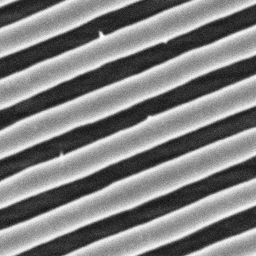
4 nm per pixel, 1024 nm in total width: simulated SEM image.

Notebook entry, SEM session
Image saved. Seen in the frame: parallel lines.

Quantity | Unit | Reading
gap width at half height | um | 0.082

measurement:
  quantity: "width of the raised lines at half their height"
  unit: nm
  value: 106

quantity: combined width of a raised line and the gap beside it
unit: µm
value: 0.188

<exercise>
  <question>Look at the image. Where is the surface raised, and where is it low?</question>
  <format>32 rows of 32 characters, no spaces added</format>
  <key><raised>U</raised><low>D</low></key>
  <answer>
UDDDDDDDUUUUUUUUDDDDDDDUUUUUUUUU
DDDDDUUUUUUUUDDDDDDDUUUUUUUUUDDD
DDDUUUUUUUUDDDDDDDUUUUUUUUUDDDDD
UUUUUUUUUDDDDDDUUUUUUUUUUDDDDDDU
UUUUUUUDDDDDDUUUUUUUUUDDDDDDDUUU
UUUUDDDDDDDUUUUUUUUDDDDDDDUUUUUU
UUDDDDDDUUUUUUUUUDDDDDDDUUUUUUUU
DDDDDDUUUUUUUUDDDDDDDUUUUUUUUUDD
DDDDUUUUUUUUDDDDDDDUUUUUUUUDDDDD
DUUUUUUUUDDDDDDDDUUUUUUUUDDDDDDD
UUUUUUUDDDDDDDUUUUUUUUUDDDDDDUUU
UUUUUDDDDDDDUUUUUUUUUDDDDDDUUUUU
UUUDDDDDDUUUUUUUUUDDDDDDUUUUUUUU
DDDDDDDUUUUUUUUUDDDDDDUUUUUUUUUD
DDDDUUUUUUUUUDDDDDDUUUUUUUUUDDDD
DDUUUUUUUUUDDDDDDUUUUUUUUUDDDDDD
UUUUUUUUDDDDDDDUUUUUUUUUDDDDDDUU
UUUUUUDDDDDDUUUUUUUUUDDDDDDDUUUU
UUUDDDDDDDUUUUUUUUUDDDDDDUUUUUUU
UDDDDDDDUUUUUUUUDDDDDDDUUUUUUUUU
DDDDDUUUUUUUUUDDDDDDUUUUUUUUUDDD
DDDUUUUUUUUUDDDDDDUUUUUUUUUDDDDD
DUUUUUUUUDDDDDDUUUUUUUUUUDDDDDDU
UUUUUUUDDDDDDUUUUUUUUUDDDDDDDUUU
UUUUDDDDDDDUUUUUUUUUDDDDDDUUUUUU
UDDDDDDDUUUUUUUUUUDDDDDDUUUUUUUU
DDDDDDUUUUUUUUUDDDDDDDUUUUUUUUDD
DDDDUUUUUUUUDDDDDDDUUUUUUUUDDDDD
DUUUUUUUUUDDDDDDDUUUUUUUUDDDDDDD
UUUUUUUDDDDDDDUUUUUUUUUDDDDDDDUU
UUUUUDDDDDDUUUUUUUUUDDDDDDDUUUUU
UUUDDDDDDUUUUUUUUUDDDDDDDUUUUUUU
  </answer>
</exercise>